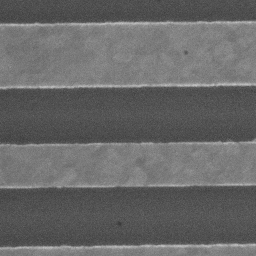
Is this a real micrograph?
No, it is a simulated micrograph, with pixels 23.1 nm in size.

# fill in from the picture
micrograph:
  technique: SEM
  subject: lines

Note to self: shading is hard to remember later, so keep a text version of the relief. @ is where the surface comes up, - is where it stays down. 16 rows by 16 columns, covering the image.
----------------
------@@@@@@@@@@
@@@@@@@@@@@@@@@@
@@@@@@@@@@@@@@@@
@@@@@@@@@@@@@@@@
----------------
----------------
----------------
----------------
@@@@@@@@@@@@@@@@
@@@@@@@@@@@@@@@@
@@@@@@@@@@@@@@@@
----------------
----------------
----------------
-@-@@@@@@@@@@@@@